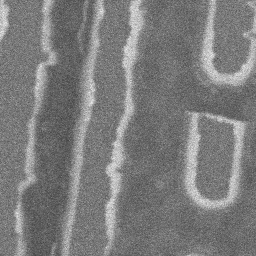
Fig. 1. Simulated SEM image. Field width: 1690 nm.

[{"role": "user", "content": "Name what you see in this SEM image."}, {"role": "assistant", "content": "one or a few lines or trenches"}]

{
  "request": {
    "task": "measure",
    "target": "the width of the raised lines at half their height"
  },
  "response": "275 nanometers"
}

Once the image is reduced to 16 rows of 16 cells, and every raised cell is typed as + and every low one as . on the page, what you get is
+++...+++....+++
+++...+++....+++
+++...++.....+++
+++...++.....+++
+++...++.....++.
+++..+++........
++...+++........
++...+++....++..
++...+++....+++.
++...+++....+++.
++...++.....+++.
++...++.....+++.
+....++.....++..
+...+++.........
+...+++.........
+...+++.........